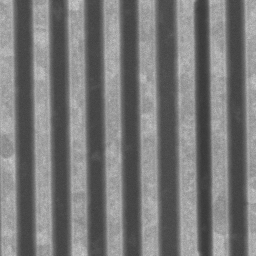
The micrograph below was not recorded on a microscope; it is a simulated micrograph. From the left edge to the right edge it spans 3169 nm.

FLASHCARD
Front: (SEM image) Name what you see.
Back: parallel lines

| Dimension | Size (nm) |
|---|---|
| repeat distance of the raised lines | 437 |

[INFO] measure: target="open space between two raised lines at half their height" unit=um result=0.212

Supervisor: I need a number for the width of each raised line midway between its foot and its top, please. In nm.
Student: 223